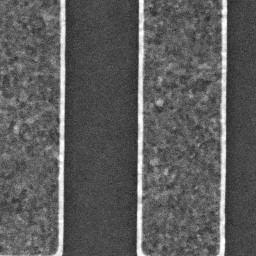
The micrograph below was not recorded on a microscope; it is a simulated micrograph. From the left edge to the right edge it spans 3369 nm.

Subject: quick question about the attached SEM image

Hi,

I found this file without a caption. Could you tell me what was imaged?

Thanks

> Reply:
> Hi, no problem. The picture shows wiring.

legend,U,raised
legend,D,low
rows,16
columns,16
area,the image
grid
UUUUDDDDDUUUUUDD
UUUUDDDDDUUUUUDD
UUUUDDDDDUUUUUDD
UUUUDDDDDUUUUUDD
UUUUDDDDDUUUUUDD
UUUUDDDDDUUUUUDD
UUUUDDDDDUUUUUDD
UUUUDDDDDUUUUUDD
UUUUDDDDDUUUUUDD
UUUUDDDDDUUUUUDD
UUUUDDDDDUUUUUDD
UUUUDDDDDUUUUUDD
UUUUDDDDDUUUUUDD
UUUUDDDDDUUUUUDD
UUUUDDDDDUUUUUDD
UUUUDDDDDUUUUUDD